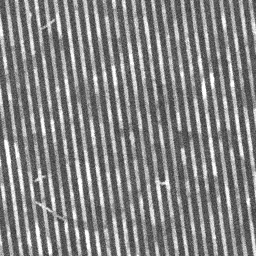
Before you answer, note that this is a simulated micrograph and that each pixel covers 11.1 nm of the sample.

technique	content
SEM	parallel lines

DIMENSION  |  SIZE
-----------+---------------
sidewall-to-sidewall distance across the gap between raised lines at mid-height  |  0.0794 micrometres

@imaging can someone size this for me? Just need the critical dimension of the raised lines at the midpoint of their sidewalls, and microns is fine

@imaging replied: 0.0274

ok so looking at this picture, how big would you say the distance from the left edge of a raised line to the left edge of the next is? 107 nm